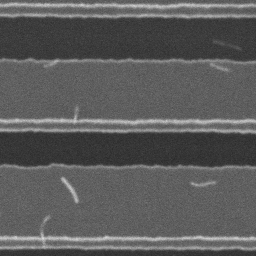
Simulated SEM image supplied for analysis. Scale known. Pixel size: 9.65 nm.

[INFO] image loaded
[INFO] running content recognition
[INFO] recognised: lines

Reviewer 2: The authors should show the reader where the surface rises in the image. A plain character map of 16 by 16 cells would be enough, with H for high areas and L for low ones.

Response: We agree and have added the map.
HHHHHHHHHHHHHHHH
LLLLLLLLLLLLLLLL
LLLLLLLLLLLLLLLL
LLLLLLLLLLLLLLLL
HHHHHHHHHHHHHHHH
HHHHHHHHHHHHHHHH
HHHHHHHHHHHHHHHH
HHHHHHHHHHHHHHHH
LLLLLLLLLLLLLLLL
LLLLLLLLLLLLLLLL
HHHHHHHHHHHHHHHH
HHHHHHHHHHHHHHHH
HHHHHHHHHHHHHHHH
HHHHHHHHHHHHHHHH
HHHHHHHHHHHHHHHH
HHHHLHHHHHHHHHHH